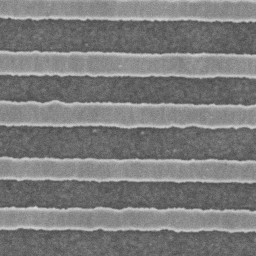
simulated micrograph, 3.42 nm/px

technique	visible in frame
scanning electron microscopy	lines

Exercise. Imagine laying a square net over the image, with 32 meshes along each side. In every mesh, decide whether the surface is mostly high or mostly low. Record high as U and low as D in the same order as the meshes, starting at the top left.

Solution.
UUUUUUUUUUUUUUUUUUUUUUUUUUUUUUUU
UUUUUUUUUUUUUUUUUUUUUUUUUUUUUUUU
DDDDUDDDDDUDDUUUUUUUUUUUUUUUUUUU
DDDDDDDDDDDDDDDDDDDDDDDDDDDDDDDD
DDDDDDDDDDDDDDDDDDDDDDDDDDDDDDDD
DDDDDDDDDDDDDDDDDDDDDDDDDDDDDDDD
UDDDUDDDDDDDDDDDDDDDDDDDDDDDDDDD
UUUUUUUUUUUUUUUUUUUUUUUUUUUUUUUU
UUUUUUUUUUUUUUUUUUUUUUUUUUUUUUUU
DDDDDDDDDDDUUUUUUUUUUUUUUUUUUUUU
DDDDDDDDDDDDDDDDDDDDDDDDDDDDDDDD
DDDDDDDDDDDDDDDDDDDDDDDDDDDDDDDD
DDDDDDDDDDDDDDDDDDDDDDDDDDDDDDDD
UUUUUUUUUUUUUUUUUUUUUUUUUUUUUUUU
UUUUUUUUUUUUUUUUUUUUUUUUUUUUUUUU
UUUUUUUUUUUUUUUUUUUUUUUUUUUUUUUU
DDDDDDDDDDDDDDDDDDDDDDDDDDDDDDDD
DDDDDDDDDDDDDDDDDDDDDDDDDDDDDDDD
DDDDDDDDDDDDDDDDDDDDDDDDDDDDDDDD
DDDDDDDDDDDDDDDDDDDDDDDDDDDDDDDD
UUUUUUUUUUUUUUUUUUUUUUUUUUUUUUUU
UUUUUUUUUUUUUUUUUUUUUUUUUUUUUUUU
DDUDUUUUUUUUUUUUUUUUUUUUUUUUUUUU
DDDDDDDDDDDDDDDDDDDDDDDDDDDDDDDD
DDDDDDDDDDDDDDDDDDDDDDDDDDDDDDDD
DDDDDDDDDDDDDDDDDDDDDDDDDDDDDDDD
UUUUUUUUUUUUUUUUUUUUUUUUUUUUUUUU
UUUUUUUUUUUUUUUUUUUUUUUUUUUUUUUU
UUUUUUUUUUUUUUUUUUUUUUUUUUUUUUUU
DDDDDDDDDDDDDDDDDDDDDDDDDDDDDDDD
DDDDDDDDDDDDDDDDDDDDDDDDDDDDDDDD
DDDDDDDDDDDDDDDDDDDDDDDDDDDDDDDD